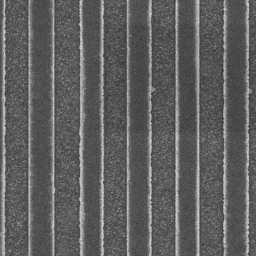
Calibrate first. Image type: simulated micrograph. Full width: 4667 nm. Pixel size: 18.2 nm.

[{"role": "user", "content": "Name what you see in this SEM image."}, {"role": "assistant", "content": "lines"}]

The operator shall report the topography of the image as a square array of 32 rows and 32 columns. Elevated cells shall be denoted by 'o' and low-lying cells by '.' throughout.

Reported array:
....ooo...ooo...ooo...ooo...ooo.
....ooo...ooo...ooo...ooo...ooo.
....ooo...ooo...ooo...ooo...ooo.
....ooo...ooo...ooo...ooo...ooo.
....ooo...ooo...ooo...ooo...ooo.
....ooo...ooo...ooo...ooo...ooo.
....ooo...ooo...ooo...ooo...ooo.
....ooo...ooo...ooo...ooo...ooo.
....ooo...ooo...ooo...ooo...ooo.
....ooo...ooo...ooo...ooo...ooo.
....ooo...ooo...ooo...ooo...ooo.
....ooo...ooo...ooo...ooo...ooo.
....ooo...ooo...ooo...ooo...ooo.
....ooo...ooo...ooo...ooo...ooo.
....ooo...ooo...ooo...ooo...ooo.
....ooo...ooo...ooo...ooo...ooo.
....ooo...ooo...ooo...ooo...ooo.
....ooo...ooo...ooo...ooo...ooo.
....ooo...ooo...ooo...ooo...ooo.
....ooo...ooo...ooo...ooo...ooo.
....ooo...ooo...ooo...ooo...ooo.
....ooo...ooo...ooo...ooo...ooo.
....ooo...ooo...ooo...ooo...ooo.
....ooo...ooo...ooo...ooo...ooo.
....ooo...ooo...ooo...ooo...ooo.
....ooo...ooo...ooo...ooo...ooo.
....ooo...ooo...ooo...ooo...ooo.
....ooo...ooo...ooo...ooo...ooo.
....ooo...ooo...ooo...ooo...ooo.
....ooo...ooo...ooo...ooo...ooo.
....ooo...ooo...ooo...ooo...ooo.
....ooo...ooo...ooo...ooo...ooo.